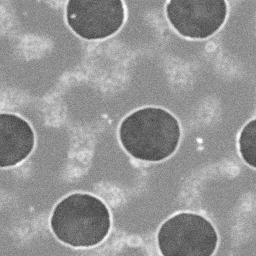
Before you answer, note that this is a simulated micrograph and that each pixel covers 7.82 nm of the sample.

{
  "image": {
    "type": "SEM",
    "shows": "holes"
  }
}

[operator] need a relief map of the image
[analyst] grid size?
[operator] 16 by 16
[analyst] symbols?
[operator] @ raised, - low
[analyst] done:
@@@@----@@----@@
@@@@----@@@---@@
@@@@@@@@@@@@@@@@
@@@@@@@@@@@@@@@@
@@@@@@@@@@@@@@@@
@@@@@@@@@@@@@@@@
@@@@@@@@@@@@@@@@
-@@@@@@@---@@@@@
--@@@@@----@@@@-
--@@@@@@---@@@@-
@@@@@@@@@@@@@@@@
@@@@@@@@@@@@@@@@
@@@@--@@@@@@@@@@
@@@----@@@@--@@@
@@@----@@@---@@@
@@@@@@@@@@---@@@